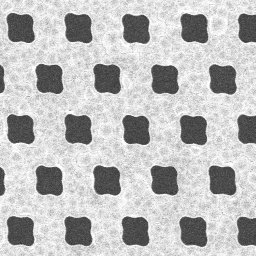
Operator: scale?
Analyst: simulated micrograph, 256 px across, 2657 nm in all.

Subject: a regular array of holes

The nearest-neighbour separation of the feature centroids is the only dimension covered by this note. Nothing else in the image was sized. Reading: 600 nm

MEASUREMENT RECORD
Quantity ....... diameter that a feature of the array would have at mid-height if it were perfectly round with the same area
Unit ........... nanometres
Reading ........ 314